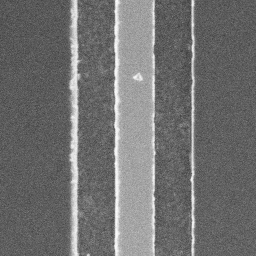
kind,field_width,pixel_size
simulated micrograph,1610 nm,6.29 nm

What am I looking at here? lines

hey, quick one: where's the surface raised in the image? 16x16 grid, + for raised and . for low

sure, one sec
+++++..+++..++++
+++++..+++..++++
+++++..+++..++++
+++++..+++..++++
+++++..+++..++++
+++++..+++..++++
+++++..+++..++++
+++++..+++..++++
+++++..+++..++++
+++++..+++..++++
+++++..+++..++++
+++++..+++..++++
+++++..+++..++++
+++++..+++..++++
+++++..+++..++++
+++++..+++..++++